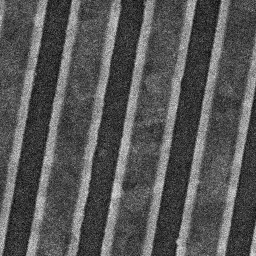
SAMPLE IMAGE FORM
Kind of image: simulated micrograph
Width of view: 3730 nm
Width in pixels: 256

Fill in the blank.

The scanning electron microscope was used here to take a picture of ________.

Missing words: one or a few lines or trenches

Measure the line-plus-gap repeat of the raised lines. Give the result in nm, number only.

1070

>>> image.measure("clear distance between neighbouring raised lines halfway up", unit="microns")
0.475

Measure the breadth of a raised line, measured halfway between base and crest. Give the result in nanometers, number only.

601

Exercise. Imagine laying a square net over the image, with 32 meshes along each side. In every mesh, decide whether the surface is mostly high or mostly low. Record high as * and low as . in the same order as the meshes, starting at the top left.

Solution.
*****....*****.....*****....****
*****....*****.....*****....****
*****....*****....******....****
*****....*****....*****.....****
*****....*****....*****....*****
****.....*****....*****....*****
****....******....*****....*****
****....*****.....*****....*****
****....*****....*****.....*****
****....*****....*****.....*****
****....*****....*****....*****.
***.....*****....*****....*****.
***....*****.....*****....*****.
***....*****....******....*****.
***....*****....*****.....*****.
***....*****....*****....*****..
**.....*****....*****....*****..
**....******....*****....*****..
**....*****.....*****....*****..
**....*****....******....*****..
**....*****....*****.....*****..
**....*****....*****....*****...
*.....*****....*****....*****...
*....*****.....*****....*****...
*....*****.....*****....*****...
*....*****....*****.....*****...
*....*****....*****.....*****...
*....*****....*****....*****....
....******....*****....*****....
....*****.....*****....*****....
....*****....******....*****....
....*****....*****.....*****....